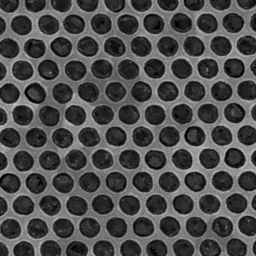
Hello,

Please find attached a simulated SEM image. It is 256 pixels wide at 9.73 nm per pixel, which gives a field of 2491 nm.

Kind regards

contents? a regular array of holes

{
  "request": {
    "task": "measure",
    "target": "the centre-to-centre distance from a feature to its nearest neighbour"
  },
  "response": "0.249 micrometres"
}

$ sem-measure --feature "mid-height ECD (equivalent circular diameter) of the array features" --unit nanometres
206